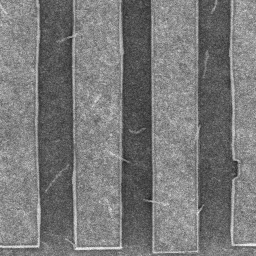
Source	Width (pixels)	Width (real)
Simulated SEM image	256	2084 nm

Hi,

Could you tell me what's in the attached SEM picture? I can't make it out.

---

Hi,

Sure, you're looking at one or a few lines or trenches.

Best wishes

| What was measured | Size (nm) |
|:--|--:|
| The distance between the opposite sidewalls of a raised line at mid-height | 372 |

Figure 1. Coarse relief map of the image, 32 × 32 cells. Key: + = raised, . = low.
+++++....++++++....++++++....+++
+++++....++++++....++++++....+++
+++++....++++++....++++++....+++
+++++....++++++....++++++....+++
+++++....++++++....++++++....+++
+++++....++++++....++++++....+++
+++++....++++++....++++++....+++
+++++....++++++....++++++....+++
+++++....++++++....++++++....+++
+++++....++++++....++++++....+++
+++++....++++++....++++++....+++
+++++....++++++....++++++....+++
+++++....++++++....++++++....+++
+++++....++++++....++++++....+++
+++++....++++++....++++++....+++
+++++....++++++....++++++....+++
+++++....++++++....++++++....+++
+++++....++++++....++++++....+++
+++++....++++++....++++++....+++
+++++....++++++....++++++....+++
+++++....++++++....++++++.....++
+++++....++++++....++++++.....++
+++++....++++++....++++++....+++
+++++....++++++....++++++....+++
+++++....++++++....++++++....+++
+++++....++++++....++++++....+++
+++++....++++++....++++++....+++
+++++....++++++....++++++....+++
+++++.....+++++....++++++....+++
+++++.....+++++....++++++....+++
+++++.....+++++....++++++....+++
................................